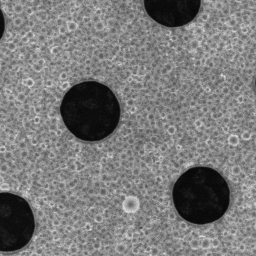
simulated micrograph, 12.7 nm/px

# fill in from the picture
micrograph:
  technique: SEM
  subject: holes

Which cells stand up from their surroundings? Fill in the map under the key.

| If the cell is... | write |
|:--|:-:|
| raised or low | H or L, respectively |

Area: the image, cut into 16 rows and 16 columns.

HHHHHHHHHLLLHHHH
HHHHHHHHHHLLHHHH
HHHHHHHHHHHHHHHH
HHHHHHHHHHHHHHHH
HHHHHHHHHHHHHHHH
HHHHLLLHHHHHHHHH
HHHHLLLHHHHHHHHH
HHHHLLLHHHHHHHHH
HHHHHLLHHHHHHHHH
HHHHHHHHHHHHHHHH
HHHHHHHHHHHHLHHH
HHHHHHHHHHHLLLHH
LLHHHHHHHHHLLLHH
LLHHHHHHHHHLLLHH
LLHHHHHHHHHHHHHH
LHHHHHHHHHHHHHHH